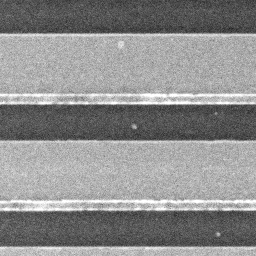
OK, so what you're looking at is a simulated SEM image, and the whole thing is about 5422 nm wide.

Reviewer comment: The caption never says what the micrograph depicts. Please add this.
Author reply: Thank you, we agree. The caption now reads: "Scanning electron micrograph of lines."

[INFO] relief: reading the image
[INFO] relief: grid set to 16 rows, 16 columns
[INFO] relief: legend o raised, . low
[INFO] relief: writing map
................
................
oooooooooooooooo
oooooooooooooooo
oooooooooooooooo
oooooooooooooooo
................
................
................
oooooooooooooooo
oooooooooooooooo
oooooooooooooooo
oooooooooooooooo
................
................
oooooooooooooooo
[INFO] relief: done